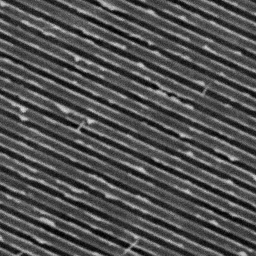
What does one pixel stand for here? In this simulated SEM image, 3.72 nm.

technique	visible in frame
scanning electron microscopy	parallel lines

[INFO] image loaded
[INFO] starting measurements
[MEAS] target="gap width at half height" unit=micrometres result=0.0224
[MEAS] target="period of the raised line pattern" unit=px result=17.3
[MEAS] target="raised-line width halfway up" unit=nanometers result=41.8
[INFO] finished